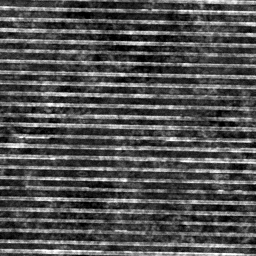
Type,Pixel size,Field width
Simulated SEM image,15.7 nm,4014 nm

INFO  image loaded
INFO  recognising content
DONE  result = parallel lines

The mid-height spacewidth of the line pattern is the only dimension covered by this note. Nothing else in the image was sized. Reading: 124 nanometers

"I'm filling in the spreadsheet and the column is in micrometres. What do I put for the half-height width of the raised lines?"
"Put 0.0451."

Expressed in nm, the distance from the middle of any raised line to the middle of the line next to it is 165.